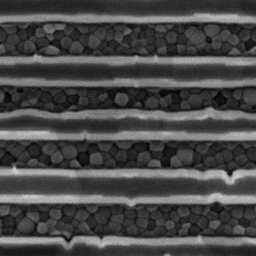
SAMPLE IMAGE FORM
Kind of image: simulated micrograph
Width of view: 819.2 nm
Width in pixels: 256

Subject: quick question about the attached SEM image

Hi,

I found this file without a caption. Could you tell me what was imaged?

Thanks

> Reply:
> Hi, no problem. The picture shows one or a few lines or trenches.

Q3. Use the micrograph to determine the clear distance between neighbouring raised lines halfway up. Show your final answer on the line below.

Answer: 122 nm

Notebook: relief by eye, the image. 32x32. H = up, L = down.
HHHHHHHHHHHHHHHHHHHHHHHHHHHHHHHH
HHHHHHHHHHHHHHHHHHHHHHHHHHHHHHHH
LLLLLLLLLLLLLLLLLLLLLLLLLLLLLLLL
LLLLLLLLLLLLLLLLLLLLLLLLLLLLLLLL
LLLLLLLLLLLLLLLLLLLLLLLLLLLLLLLL
LLLLLLLLLLLLLLLLLLLLLLLLLLLLLLLL
LLLLLLLLLLLLLLLLLLLLLLLLLLLLLLLL
LLLLHHLHHHHHLLHHHHLHLLLLLLLHHHLL
HHHHHHHHHHHHHHHHHHHHHHHHHHHHHHHH
HHHHHHHHHHHHHHHHHHHHHHHHHHHHHHHH
LLLLLLLLLLHHHLLLHHLLHHHHHHHHHLLL
LLLLLLLLLLLLLLLLLLLLLLLLLLLLLLLL
LLLLLLLLLLLLLLLLLLLLLLLLLLLLLLLL
LLLLLLLLLLLLLLLLLLLLLLLLLLLLLLLL
HHHHHHHHHHHHHHHHHHHHHHHHHHHHHHHL
HHHHHHHHHHHHHHHHHHHHHHHHHHHHHHHH
HHHHHHHHHHHHHHHHHHHHHHHHHHHHHHHH
LLLLLLLLLLLLLLLLLLLLLLLLLLLLLLLL
LLLLLLLLLLLLLLLLLLLLLLLLLLLLLLLL
LLLLLLLLLLLLLLLLLLLLLLLLLLLLLLLL
LLLLLLLLLLLLLLLLLLLLLLLLLLLLLLLL
LHLLLLLLLLLLLLLHHHHLLLLLLLLLLLLL
HHHHHHHHHHHHHHHHHHHHHHHHHHHHHHHH
HHHHHHHHHHHHHHHHHHHHHHHHHHHHHHHH
HHHHHHHHHHHHHHHHHHHHHHHHHHHHHHHH
LLLLLLLLLLLLLLLLLLLLLLLLLLLLLLLL
LLLLLLLLLLLLLLLLLLLLLLLLLLLLLLLL
LLLLLLLLLLLLLLLLLLLLLLLLLLLLLLLL
LLLLLLLLLLLLLLLLLLLLLLLLLLLLLLLL
LLLLLLLLLLLLLLLLLLLLLLLLLLLLLLLL
HHHHHHHHLHHHHHHHHHHHHHHHHHHHHHHH
HHHHHHHHHHHHHHHHHHHHHHHHHHHHHHHH